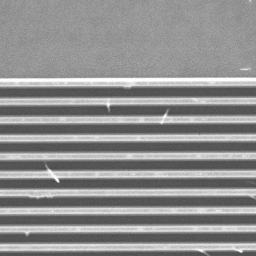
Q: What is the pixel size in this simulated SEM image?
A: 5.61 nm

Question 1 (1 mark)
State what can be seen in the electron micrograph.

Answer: parallel lines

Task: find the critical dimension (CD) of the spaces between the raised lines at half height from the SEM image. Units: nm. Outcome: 63.1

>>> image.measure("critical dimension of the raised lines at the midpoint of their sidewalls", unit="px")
7.49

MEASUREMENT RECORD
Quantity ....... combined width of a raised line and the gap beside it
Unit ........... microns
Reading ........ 0.102